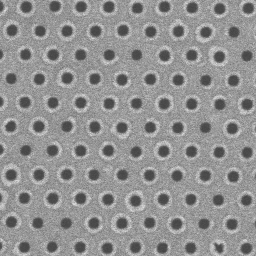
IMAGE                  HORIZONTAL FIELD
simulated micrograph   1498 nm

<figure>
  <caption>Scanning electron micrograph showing a regular array of holes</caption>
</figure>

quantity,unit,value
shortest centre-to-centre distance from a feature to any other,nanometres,159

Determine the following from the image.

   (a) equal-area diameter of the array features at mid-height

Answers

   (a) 10.7 pixels